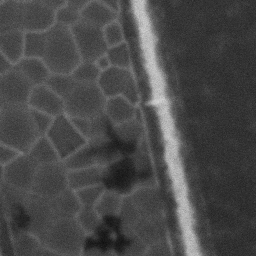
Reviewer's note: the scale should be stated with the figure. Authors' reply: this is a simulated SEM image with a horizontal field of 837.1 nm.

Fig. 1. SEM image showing one or a few lines or trenches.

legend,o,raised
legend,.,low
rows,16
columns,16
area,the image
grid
.........ooooooo
.........ooooooo
.........ooooooo
.........ooooooo
..........oooooo
..........oooooo
..........oooooo
..........oooooo
...........ooooo
...........ooooo
...........ooooo
...........ooooo
...........ooooo
............oooo
............oooo
............oooo